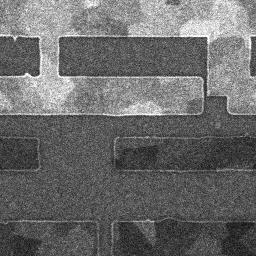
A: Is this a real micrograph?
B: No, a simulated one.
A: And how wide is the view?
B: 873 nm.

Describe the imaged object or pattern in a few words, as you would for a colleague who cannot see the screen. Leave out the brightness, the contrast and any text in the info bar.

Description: one or a few lines or trenches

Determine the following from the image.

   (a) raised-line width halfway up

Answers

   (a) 124 nm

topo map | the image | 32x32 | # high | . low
################################
################################
################################
################################
.#######......#########.########
.....##...................#####.
.....##...................#####.
.....##...................#####.
.....##...................#####.
...#.###..................#####.
#########################.######
#########################.######
#########################....###
#########################....###
................................
................................
................................
#####..........#################
#####.........##################
#####.........##################
#####.........##################
................................
................................
................................
................................
................................
................................
....................##..........
############..##################
############..##################
############..##################
############..##################